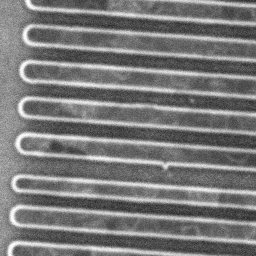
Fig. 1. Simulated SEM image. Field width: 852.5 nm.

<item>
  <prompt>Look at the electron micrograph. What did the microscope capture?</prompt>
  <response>parallel lines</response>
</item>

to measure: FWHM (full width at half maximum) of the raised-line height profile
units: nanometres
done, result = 62.3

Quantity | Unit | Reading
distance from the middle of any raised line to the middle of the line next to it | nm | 121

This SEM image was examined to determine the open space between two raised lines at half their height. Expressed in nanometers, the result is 56.5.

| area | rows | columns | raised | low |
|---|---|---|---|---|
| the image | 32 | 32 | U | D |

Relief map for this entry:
DDDDUUUUUUUUUUUUUUUUUUUUUUUUDDDD
DDDDDDDDDDDUUUUUUUUUUUUUUUUUUUUU
DDDDDDDDDDDDDDDDDDDDDDDDUUUUUUUU
DDDDUUUUDDDDDDDDDDDDDDDDDDDDDDDD
DDDUUUUUUUUUUUUUUUUUUUDDDDDDDDDD
DDDDUUUUUUUUUUUUUUUUUUUUUUUUUUUU
DDDDDDDDDDDDDDDDUUUUUUUUUUUUUUUU
DDDDDDDDDDDDDDDDDDDDDDDDDDDDDDDD
DDDUUUUUUUUUUUDDDDDDDDDDDDDDDDDD
DDDUUUUUUUUUUUUUUUUUUUUUUUUUDDDD
DDDDDDDDDDUUUUUUUUUUUUUUUUUUUUUU
DDDDDDDDDDDDDDDDDDDDDDDDUUUUUUUU
DDDUUUDDDDDDDDDDDDDDDDDDDDDDDDDD
DDDUUUUUUUUUUUUUUUUUDDDDDDDDDDDD
DDDUUUUUUUUUUUUUUUUUUUUUUUUUUUUU
DDDDDDDDDDDDDDDDUUUUUUUUUUUUUUUU
DDDDDDDDDDDDDDDDDDDDDDDDDDDDDUUU
DDUUUUUUUUUUUDDDDDDDDDDDDDDDDDDD
DDUUUUUUUUUUUUUUUUUUUUUUUUUDDDDD
DDDDDDDDUUUUUUUUUUUUUUUUUUUUUUUU
DDDDDDDDDDDDDDDDDDDDUUUUUUUUUUUU
DDDDDDDDDDDDDDDDDDDDDDDDDDDDDDDD
DDUUUUUUUUDDDDDDDDDDDDDDDDDDDDDD
DDUUUUUUUUUUUUUUUUUUUUDDDDDDDDDD
DDDDDDDDDDDDUUUUUUUUUUUUUUUUUUUU
DDDDDDDDDDDDDDDDDDDDDDDDDDUUUUUU
DDUUUUUUUUUUDDDDDDDDDDDDDDDDDDDD
DDUUUUUUUUUUUUUUUUUUUUUUUUDDDDDD
DDDDDDDUUUUUUUUUUUUUUUUUUUUUUUUU
DDDDDDDDDDDDDDDDDDDDDUUUUUUUUUUU
DDUUDDDDDDDDDDDDDDDDDDDDDDDDDDDD
DUUUUUUUUUUUUUUUUUDDDDDDDDDDDDDD